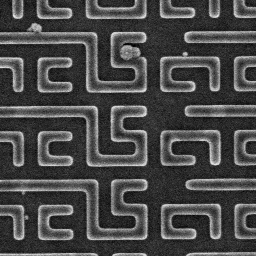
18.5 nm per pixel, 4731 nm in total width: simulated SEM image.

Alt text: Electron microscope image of wiring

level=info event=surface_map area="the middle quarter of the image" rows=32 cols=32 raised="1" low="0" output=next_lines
11000011000011111111000011111111
00000011000000000011000011100000
00000011000000000011000011100000
00000011000000000011000011100000
00000011111111111111000011111111
11000011111111111111000011111111
11000011111111111111000011111111
00000000000000000000000000000000
00000000000000000000000000000000
00000000000000000000000000000000
00000000000000000000000000000000
11111111000011111111000000000011
11111111000011111111000000000011
00000111000011100000000000000000
00000011000011100000000000000000
00000011000011100000000000000000
00000011000011110000000000000000
11000011000011111111000011111111
11000011000011111111000011111111
00000011000000000111000011100000
00000011000000000011000011100000
00000011000000000011100011100000
00000011100000000111100011100000
11000011111111111111100011111111
11000011111111111111100011111111
00000011111100000000000000000000
00000000000000000000000000000000
00000000000000000000000000000000
00000000000000000000000000000000
11111111000011111111100000000001
11111111000011111111100000000001
11111111000011111111000000000000